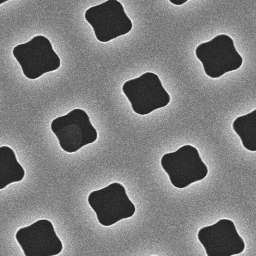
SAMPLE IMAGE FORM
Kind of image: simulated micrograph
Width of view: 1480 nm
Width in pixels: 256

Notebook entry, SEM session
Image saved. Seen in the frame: holes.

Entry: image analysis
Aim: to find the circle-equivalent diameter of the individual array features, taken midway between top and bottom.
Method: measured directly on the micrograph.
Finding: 239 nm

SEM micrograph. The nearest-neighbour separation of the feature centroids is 82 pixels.